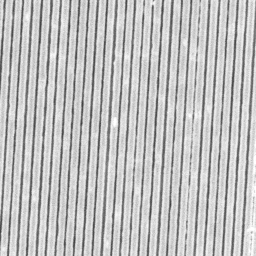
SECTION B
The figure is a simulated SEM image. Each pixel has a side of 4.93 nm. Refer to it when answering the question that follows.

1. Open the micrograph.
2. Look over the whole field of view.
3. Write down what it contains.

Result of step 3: parallel lines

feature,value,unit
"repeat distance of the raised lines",0.0459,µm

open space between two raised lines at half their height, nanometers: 12.3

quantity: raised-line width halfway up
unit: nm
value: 33.2